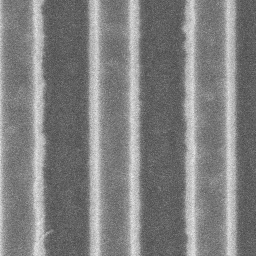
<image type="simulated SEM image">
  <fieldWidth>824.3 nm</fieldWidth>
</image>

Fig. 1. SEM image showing one or a few lines or trenches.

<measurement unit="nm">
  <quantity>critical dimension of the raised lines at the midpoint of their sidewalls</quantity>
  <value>140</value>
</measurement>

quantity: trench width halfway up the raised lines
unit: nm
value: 171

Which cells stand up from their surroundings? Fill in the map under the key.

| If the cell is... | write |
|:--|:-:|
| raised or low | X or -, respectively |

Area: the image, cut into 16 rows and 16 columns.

XX----XXX---XX--
XX----XXX---XX--
XXX---XX----XX--
XX----XX----XX--
XXX---XX----XX--
XXX---XX----XX--
XX----XX----XX--
XX----XX----XX--
XXX---XX----XX--
XXX---XX----XX--
XXX---XX----XX--
XXX---XXX---XXX-
XX----XXX---XXX-
XXX---XXX---XXX-
XXX---XXX---XXX-
XXX---XXX---XXX-